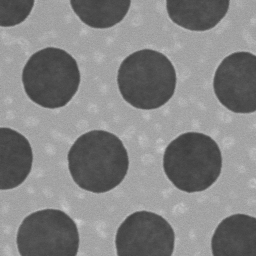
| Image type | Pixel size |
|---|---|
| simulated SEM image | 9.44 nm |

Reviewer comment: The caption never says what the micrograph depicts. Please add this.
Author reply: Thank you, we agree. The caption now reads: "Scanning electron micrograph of holes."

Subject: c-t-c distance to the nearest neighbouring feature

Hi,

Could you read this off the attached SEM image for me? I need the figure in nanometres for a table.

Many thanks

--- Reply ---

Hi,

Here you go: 892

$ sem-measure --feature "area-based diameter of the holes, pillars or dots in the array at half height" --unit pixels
60.2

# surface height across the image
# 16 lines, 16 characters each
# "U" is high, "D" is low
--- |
DDUUUDDDUUDDDDUU
DUUUUDDUUUUDDDUU
UUUUUUUUUUUUUUUU
UUDDUUUUDDUUUUDD
UDDDDUUDDDDUUDDD
UUDDDUUDDDDUUDDD
UUDDUUUUDDUUUUDD
UUUUUUUUUUUUUUUU
DUUUUDDUUUUDDUUU
DDUUDDDDUUDDDDUU
DDUUDDDDUUDDDDUU
DUUUUDDUUUUDDUUU
UUUUUUUUUUUUUUUU
UUDDUUUUDDUUUUDD
UDDDDUUDDDDUUDDD
UDDDDUUDDDDUUDDD